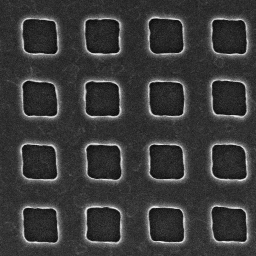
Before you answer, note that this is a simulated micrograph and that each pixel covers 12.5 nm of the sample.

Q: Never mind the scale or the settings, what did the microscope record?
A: a regular array of holes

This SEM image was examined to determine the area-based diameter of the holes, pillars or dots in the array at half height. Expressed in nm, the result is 476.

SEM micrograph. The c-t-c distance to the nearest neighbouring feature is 62.4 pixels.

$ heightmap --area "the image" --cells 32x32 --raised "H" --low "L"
HHHHHHHHHHHHHHHHHHHHHHHHHHHHHHHH
HHHHHHHHHHHHHHHHHHHHHHHHHHHHHHHH
HHHLLLHHHHHLLLHHHHHLLLHHHHHLLLHH
HHHLLLLHHHHLLLLHHHHLLLLHHHLLLLLH
HHHLLLLHHHHLLLLHHHHLLLLHHHLLLLLH
HHHLLLLHHHHLLLLHHHHLLLLHHHLLLLLH
HHHLLLLHHHHLLLLHHHHLLLLHHHHLLLLH
HHHHHHHHHHHHHHHHHHHHHHHHHHHHHHHH
HHHHHHHHHHHHHHHHHHHHHHHHHHHHHHHH
HHHHHHHHHHHHHHHHHHHHHHHHHHHHHHHH
HHHLLLHHHHHLLLHHHHHLLLLHHHHLLLHH
HHHLLLLHHHHLLLLHHHHLLLLHHHLLLLLH
HHHLLLLHHHHLLLLHHHHLLLLHHHLLLLLH
HHHLLLLHHHHLLLLHHHHLLLLHHHHLLLLH
HHHHLLLHHHHLLLHHHHHHHLHHHHHHLHHH
HHHHHHHHHHHHHHHHHHHHHHHHHHHHHHHH
HHHHHHHHHHHHHHHHHHHHHHHHHHHHHHHH
HHHHHHHHHHHHHHHHHHHHHHHHHHHHHHHH
HHHLLLLHHHHLLLLHHHHLLLLHHHHLLLHH
HHHLLLLHHHHLLLLHHHHLLLLHHHHLLLLH
HHHLLLLHHHHLLLLHHHHLLLLHHHLLLLLH
HHHLLLLHHHHLLLLHHHHLLLLHHHHLLLLH
HHHHHHHHHHHHHHHHHHHHLLHHHHHHHHHH
HHHHHHHHHHHHHHHHHHHHHHHHHHHHHHHH
HHHHHHHHHHHHHHHHHHHHHHHHHHHHHHHH
HHHHHHHHHHHHHHHHHHHHHHHHHHHHHHHH
HHHLLLLHHHHLLLLHHHHLLLLHHHLLLLLH
HHHLLLLHHHHLLLLHHHHLLLLHHHHLLLLH
HHHLLLLHHHHLLLLHHHHLLLLHHHHLLLLH
HHHLLLLHHHHLLLLHHHHLLLLHHHHLLLLH
HHHHHHHHHHHHHHHHHHHHHHHHHHHHHHHH
HHHHHHHHHHHHHHHHHHHHHHHHHHHHHHHH